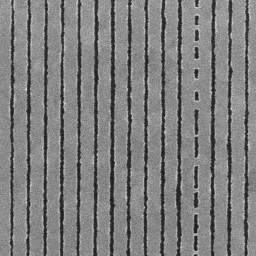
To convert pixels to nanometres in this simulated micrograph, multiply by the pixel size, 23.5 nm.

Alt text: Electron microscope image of parallel lines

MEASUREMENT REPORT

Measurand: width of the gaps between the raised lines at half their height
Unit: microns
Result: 0.0882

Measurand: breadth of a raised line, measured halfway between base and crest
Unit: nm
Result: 303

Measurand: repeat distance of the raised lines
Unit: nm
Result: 394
